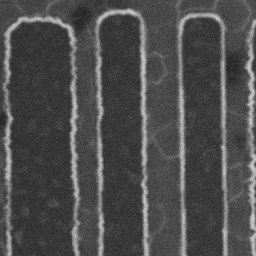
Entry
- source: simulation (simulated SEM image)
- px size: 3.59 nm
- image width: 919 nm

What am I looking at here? one or a few lines or trenches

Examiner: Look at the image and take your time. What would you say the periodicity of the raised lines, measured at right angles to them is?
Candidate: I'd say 291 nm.